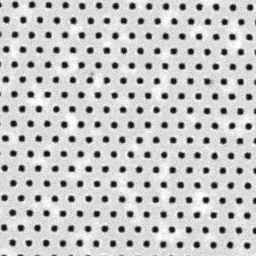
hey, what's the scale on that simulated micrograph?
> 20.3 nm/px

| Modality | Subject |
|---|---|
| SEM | a regular array of holes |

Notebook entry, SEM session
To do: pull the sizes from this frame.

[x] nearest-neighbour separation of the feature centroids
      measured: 16.3 pixels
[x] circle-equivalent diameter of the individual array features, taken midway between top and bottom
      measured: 0.155 µm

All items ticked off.